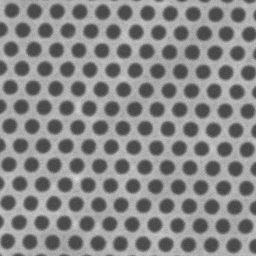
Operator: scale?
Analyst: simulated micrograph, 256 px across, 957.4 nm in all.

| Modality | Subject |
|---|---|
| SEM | a regular array of holes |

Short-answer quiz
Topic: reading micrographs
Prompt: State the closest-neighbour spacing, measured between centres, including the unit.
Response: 0.0825 microns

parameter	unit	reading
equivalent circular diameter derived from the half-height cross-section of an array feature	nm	59.5